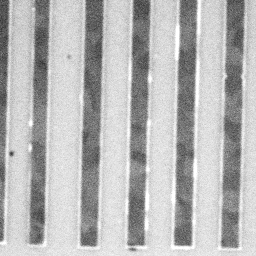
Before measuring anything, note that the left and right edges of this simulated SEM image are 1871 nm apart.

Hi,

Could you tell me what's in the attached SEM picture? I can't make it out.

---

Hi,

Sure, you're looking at parallel lines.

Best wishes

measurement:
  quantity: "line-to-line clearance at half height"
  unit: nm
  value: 195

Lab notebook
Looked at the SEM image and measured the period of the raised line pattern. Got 0.353 um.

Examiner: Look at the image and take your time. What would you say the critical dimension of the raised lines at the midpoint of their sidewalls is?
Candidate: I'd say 20.8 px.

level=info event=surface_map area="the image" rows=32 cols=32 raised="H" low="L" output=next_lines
HLLLHHLLLLLHHLLLLHHLLLHHHLLLHHHL
HLLLHHLLLLLHHLLLLHHLLLHHHLLLHHHL
HLLLHHLLLLLHHLLLHHHLLLHHHLLLHHHL
HLLLHHLLLLLHHLLLHHHLLLHHHLLLHHHL
HLLLHHLLLLLHHLLLHHHLLLHHHLLLHHHL
HLLLHHLLLLHHHLLLHHHLLLHHHLLLHHHL
HLLLHHLLLLHHHLLLHHHLLLHHHLLLHHHL
HLLLHHLLLLHHHLLLHHHLLLHHHLLLHHLL
HLLLHHLLLLHHHLLLHHHLLLHHHLLLHHLL
HLLLHHLLLLHHHLLLHHHLLLHHHLLLHHLL
HLLLHHLLLLHHHLLLHHHLLLHHHLLLHHLL
HLLLHHLLLLHHHLLLHHHLLLHHHLLLHHLL
HLLLHHLLLLHHHLLLHHHLLLHHHLLLHHLL
HLLLHHLLLLHHHLLLHHHLLLHHHLLLHHLL
HLLLHHLLLLHHHLLLHHHLLLHHHLLLHHLL
HLLLHHLLLLHHHLLLHHHLLLHHLLLLHHLL
HLLLHHLLLLHHHLLLHHHLLLHHLLLLHHLL
HLLLHHLLLLHHHLLLHHLLLLHHLLLLHHLL
HLLLHHLLLLHHHLLLHHLLLLHHLLLLHHLL
HLLLHHLLLLHHHLLLHHLLLLHHLLLLHHLL
HLLLHHLLLLHHHLLLHHLLLLHHLLLLHHLL
HLLLHHLLLLHHHLLLHHLLLLHHLLLLHHLL
HLLLHHLLLLHHHLLLHHLLLLHHLLLLHHLL
HLLLHHLLLLHHHLLLHHLLLLHHLLLLHHLL
HLLLHHLLLLHHHLLLHHLLLLHHLLLLHHLL
HLLLHHLLLLHHLLLLHHLLLLHHLLLLHHLL
HLLLHHLLLLHHLLLLHHLLLLHHLLLLHHLL
HLLLHHLLLLHHLLLLHHLLLLHHLLLLHHLL
HLLLHHLLLLHHLLLLHHLLLLHHLLLHHHLL
HLLLHHLLLLHHLLLLHHLLLLHHLLLHHHLL
LLLLHLLLLLHHLLLLHHLLLLHHLLLHHHLL
LLLLLLLLLLLLLLLLLLLLLLLLLLLLLLLL